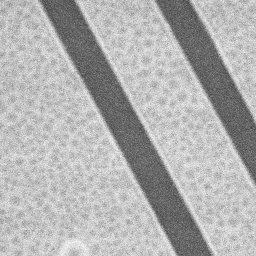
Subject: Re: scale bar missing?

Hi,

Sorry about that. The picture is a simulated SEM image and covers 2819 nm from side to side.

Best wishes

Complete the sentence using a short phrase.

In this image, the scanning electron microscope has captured one or a few lines or trenches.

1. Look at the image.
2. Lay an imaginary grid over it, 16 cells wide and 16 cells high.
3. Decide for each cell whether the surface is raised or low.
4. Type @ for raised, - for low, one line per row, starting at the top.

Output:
@@---@@@@@--@@@@
@@@---@@@@---@@@
@@@@--@@@@@--@@@
@@@@---@@@@---@@
@@@@@--@@@@@---@
@@@@@---@@@@---@
@@@@@@--@@@@@---
@@@@@@---@@@@@--
@@@@@@@--@@@@@--
@@@@@@@---@@@@@-
@@@@@@@@---@@@@-
@@@@@@@@---@@@@@
@@@@@@@@@---@@@@
@@@@@@@@@@--@@@@
@@@@@@@@@@---@@@
@@@@@@@@@@@--@@@